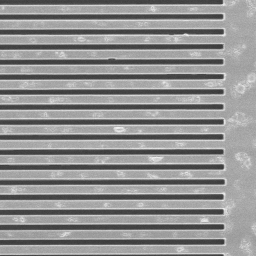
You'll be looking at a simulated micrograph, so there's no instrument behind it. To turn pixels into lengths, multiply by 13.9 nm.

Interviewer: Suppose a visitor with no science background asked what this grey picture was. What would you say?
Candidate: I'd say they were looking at parallel lines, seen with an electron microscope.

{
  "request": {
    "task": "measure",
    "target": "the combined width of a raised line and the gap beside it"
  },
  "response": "209 nanometers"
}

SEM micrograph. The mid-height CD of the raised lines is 131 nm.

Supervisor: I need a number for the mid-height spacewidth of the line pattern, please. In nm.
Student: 78.4